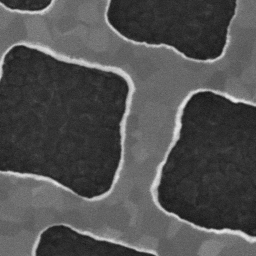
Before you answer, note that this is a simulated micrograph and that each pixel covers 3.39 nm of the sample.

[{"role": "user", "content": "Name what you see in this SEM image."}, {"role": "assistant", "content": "holes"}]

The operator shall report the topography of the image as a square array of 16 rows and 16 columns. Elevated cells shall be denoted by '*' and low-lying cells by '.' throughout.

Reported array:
*..****........*
*******.......**
********......**
...*********..**
.......*********
........********
........****...*
........***.....
........***.....
........***.....
.......***......
****...***......
**********......
***********.....
***..**********.
**......********